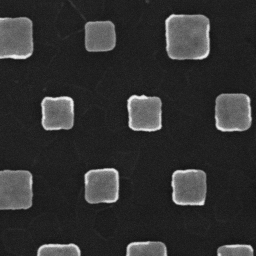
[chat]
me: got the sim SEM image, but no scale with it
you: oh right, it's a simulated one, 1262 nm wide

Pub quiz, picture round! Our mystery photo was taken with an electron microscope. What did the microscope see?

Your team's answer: raised bodies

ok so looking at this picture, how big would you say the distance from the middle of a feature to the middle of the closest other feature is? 427 nanometres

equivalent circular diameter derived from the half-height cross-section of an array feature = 184 nm